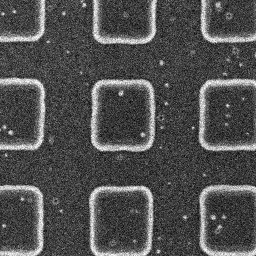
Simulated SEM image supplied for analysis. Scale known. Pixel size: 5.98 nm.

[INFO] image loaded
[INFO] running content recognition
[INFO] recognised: raised bodies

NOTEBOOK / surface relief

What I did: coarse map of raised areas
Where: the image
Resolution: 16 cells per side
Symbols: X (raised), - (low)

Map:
XXX---XXXX---XXX
XXX---XXXX---XXX
-------XX-------
----------------
----------------
XXX---XXX----XXX
XXX---XXX----XXX
XXX---XXXX---XXX
XXX---XXX----XXX
----------------
----------------
----------------
XX----XXX----XXX
XXX---XXX----XXX
XXX---XXX----XXX
XX----XXX----XXX